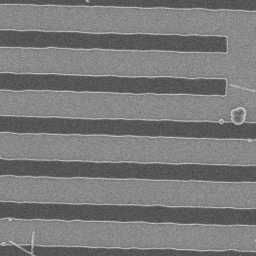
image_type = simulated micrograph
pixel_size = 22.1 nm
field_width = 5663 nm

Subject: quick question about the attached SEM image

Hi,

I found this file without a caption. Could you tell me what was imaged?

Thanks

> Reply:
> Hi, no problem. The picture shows groups of lines, slits or small figures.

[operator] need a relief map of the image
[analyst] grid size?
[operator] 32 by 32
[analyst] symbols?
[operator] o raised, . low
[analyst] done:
oooooooooooooooooooooooooooooooo
................................
................................
................................
ooooooooooooooooooooooooooo.....
oooooooooooooooooooooooooooo....
......................oooooo....
................................
................................
ooooooooooooooo.................
oooooooooooooooooooooooooooo....
.........ooooooooooooooooooo....
................................
................................
ooo..........................oo.
oooooooooooooooooooooooooooooooo
oooooooooooooooooooooooooooooooo
...............................o
................................
................................
ooooooooooooooooooooooooo.......
oooooooooooooooooooooooooooooooo
...................ooooooooooooo
................................
................................
oooooooooooo....................
oooooooooooooooooooooooooooooooo
.......ooooooooooooooooooooooooo
................................
................................
o...............................
oooooooooooooooooooooooooooooooo